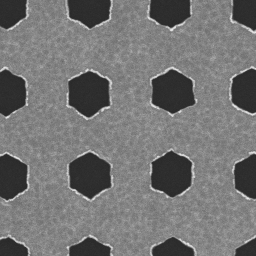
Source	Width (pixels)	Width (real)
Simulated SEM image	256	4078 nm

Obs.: holes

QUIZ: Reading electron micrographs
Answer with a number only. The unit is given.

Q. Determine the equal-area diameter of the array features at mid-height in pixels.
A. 42.6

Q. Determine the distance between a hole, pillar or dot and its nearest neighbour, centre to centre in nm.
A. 1300